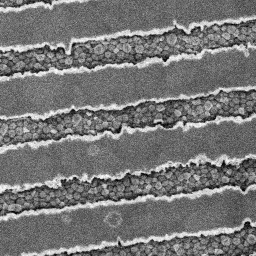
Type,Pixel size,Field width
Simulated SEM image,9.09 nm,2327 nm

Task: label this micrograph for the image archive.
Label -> one or a few lines or trenches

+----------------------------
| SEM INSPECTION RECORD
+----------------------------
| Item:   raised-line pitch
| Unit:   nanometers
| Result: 623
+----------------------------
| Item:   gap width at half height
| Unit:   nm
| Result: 253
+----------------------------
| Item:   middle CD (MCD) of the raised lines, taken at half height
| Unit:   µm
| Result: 0.371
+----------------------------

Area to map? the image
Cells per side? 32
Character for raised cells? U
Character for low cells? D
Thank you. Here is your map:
DDDDDDDUUUUUUUUUUUUUUUUUUUUUUUUU
UUUUUUUUUUUUUUUUUUUUUUUUUUUUUUUU
UUUUUUUUUUUUUUUUUUUUUUUUUUUUUUUD
UUUUUUUUUUUUUUUUUUUUUUDUDDDDDDDD
UUUUUUUUUUUUUUDDDDDDDDDDDDDDDDDD
UUUUUUUUUDDDDDDDDDDDDDDDDDDDDDDD
DDDDDDDDDDDDDDDDDDDDDDDDDUUUUUUU
DDDDDDDDDDDDDDDDDDDUDUUUUUUUUUUU
DDDDDDDDDDDDUUUUUUUUUUUUUUUUUUUU
DDUUUUUUUUUUUUUUUUUUUUUUUUUUUUUU
UUUUUUUUUUUUUUUUUUUUUUUUUUUUUUUU
UUUUUUUUUUUUUUUUUUUUUUUUUUUDDDDD
UUUUUUUUUUUUUUUUUUUUUDDDDDDDDDDD
UUUUUUUUUUUUUDDDDDDDDDDDDDDDDDDD
UUUDUUDDDDDDDDDDDDDDDDDDDDDDDDDD
DDDDDDDDDDDDDDDDDDDDDDDDDUUUUUUU
DDDDDDDDDDDDDDDUUUUUUUUUUUUUUUUU
DDDDDDDDUUUUUUUUUUUUUUUUUUUUUUUU
DDUUUUUUUUUUUUUUUUUUUUUUUUUUUUUU
UUUUUUUUUUUUUUUUUUUUUUUUUUUUUUUU
UUUUUUUUUUUUUUUUUUUUUDDDDDDDDDDD
UUUUUUUUUUUUUUUUUUUDDDDDDDDDDDDD
UUUUUUUUDDDDDDDDDDDDDDDDDDDDDDDD
UUUDDDDDDDDDDDDDDDDDDDDDDDDDUUDU
DDDDDDDDDDDDDDDDDDDDDDUUUUUUUUUU
DDDDDDDDDDDDUUUUUUUUUUUUUUUUUUUU
DDDDDUUUUUUUUUUUUUUUUUUUUUUUUUUU
UUUUUUUUUUUUUUUUUUUUUUUUUUUUUUUU
UUUUUUUUUUUUUUUUUUUUUUUUUUUUUUDD
UUUUUUUUUUUUUUUUUUUUUUDDDDDDDDDD
UUUUUUUUUUUUUDDDDDDDDDDDDDDDDDDD
UUUUUUUDDDDDDDDDDDDDDDDDDDDDDDDD